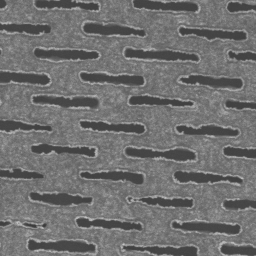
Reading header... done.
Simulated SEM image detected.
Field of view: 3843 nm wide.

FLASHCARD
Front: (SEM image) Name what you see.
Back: a regular array of holes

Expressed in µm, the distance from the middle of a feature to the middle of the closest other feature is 0.712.